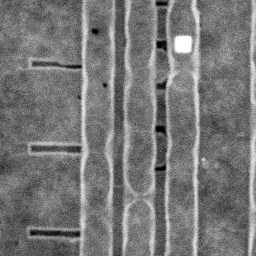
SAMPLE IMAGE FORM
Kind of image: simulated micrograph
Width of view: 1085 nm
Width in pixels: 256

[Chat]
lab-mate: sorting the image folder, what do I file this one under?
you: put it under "wiring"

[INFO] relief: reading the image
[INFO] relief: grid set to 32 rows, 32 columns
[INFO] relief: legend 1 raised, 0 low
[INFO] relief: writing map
00000000000111001110011100000000
00000000000111001110011110000000
00000000000111001110011110000000
00000000000111001110011110000000
00000000000111001110011110000000
00000000000111001110011110000000
00000000001111001110011110000001
00000000001111001110011110000001
00000000001111001110001110000000
00000000000111001110011110000000
00000000000111001110011110000000
00000000001111001110011110000000
00000000001111001110011110000000
00000000001111001110011110000000
00000000001111001110011110000000
00000000001111001110011110000000
00000000001111001110011110000000
00000000001111001110011110000000
00000000000111001110011110000000
00000000001111001110011110000000
00000000001111001110011110000000
00000000001111001110011110000000
00000000001111001110011110000001
00000000001111001110011110000001
00000000001111001110011110000001
00000000001111001110011110000000
00000000001111001110011110000000
00000000001111001110011110000000
00000000001111001110011110000000
00000000001111001110011110000001
00000000001111011110011100000001
00000000001111011110011100000001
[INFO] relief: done